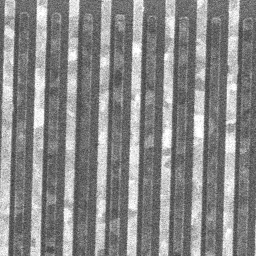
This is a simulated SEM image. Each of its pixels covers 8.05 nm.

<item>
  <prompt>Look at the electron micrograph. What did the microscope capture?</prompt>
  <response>parallel lines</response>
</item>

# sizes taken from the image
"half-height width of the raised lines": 68.4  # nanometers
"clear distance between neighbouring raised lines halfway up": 0.0483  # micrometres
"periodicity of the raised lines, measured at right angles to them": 128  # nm